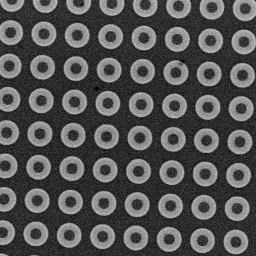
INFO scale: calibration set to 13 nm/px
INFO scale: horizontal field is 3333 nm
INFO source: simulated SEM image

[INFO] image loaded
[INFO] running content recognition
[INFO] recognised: an array of small figures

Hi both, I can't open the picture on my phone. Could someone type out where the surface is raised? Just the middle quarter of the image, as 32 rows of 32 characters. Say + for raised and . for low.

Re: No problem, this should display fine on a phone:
++++++..++++++...+++++...++++++.
++++++..++++++...++++++..++++++.
++++++..++++++...++++++..++++++.
.++++....+++++...+++++...++++++.
...........+......+++.....++++..
................................
..+.............................
+++++....++++.....+++...........
++++++..++++++...+++++...+++++..
++++++..++++++..++++++...++++++.
++++++..++++++..++++++...++++++.
+++++...++++++...+++++...+++++..
.........+++.....++++....+++++..
................................
................................
++++.....+++....................
+++++...+++++....++++....++++...
+++++...++++++..++++++...+++++..
+++++...++++++..++++++..++++++..
+++++...+++++...++++++..++++++..
.+++.....++++....++++....+++++..
..........................+++...
................................
++++............................
++++....+++++....++++....+++....
+++++..++++++...+++++...++++++..
+++++..++++++...++++++..++++++..
+++++..++++++...++++++..++++++..
++++....+++++...+++++...++++++..
.................+++.....++++...
................................
................................